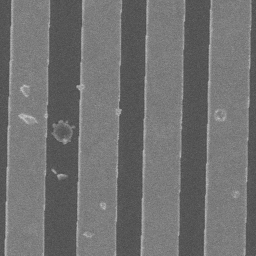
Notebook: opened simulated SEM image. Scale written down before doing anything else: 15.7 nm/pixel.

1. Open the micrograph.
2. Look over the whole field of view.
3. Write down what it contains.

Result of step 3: lines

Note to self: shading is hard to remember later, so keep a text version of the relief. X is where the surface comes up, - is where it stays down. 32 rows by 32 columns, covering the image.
-XXXXX----XXXXX---XXXXX---XXXXX-
-XXXXX----XXXXX---XXXXX---XXXXX-
-XXXXX----XXXXX---XXXXX---XXXXX-
-XXXXX----XXXXX---XXXXX---XXXXX-
-XXXXX----XXXXX---XXXXX---XXXXX-
-XXXXX----XXXXX---XXXXX---XXXXX-
-XXXXX----XXXXX---XXXXX---XXXXX-
-XXXXX----XXXXX---XXXXX---XXXXX-
-XXXXX----XXXXX---XXXXX---XXXXX-
-XXXXX----XXXXX---XXXXX---XXXXX-
-XXXXX----XXXXX---XXXXX---XXXXX-
-XXXXX----XXXXX---XXXXX---XXXXX-
-XXXXX----XXXXX---XXXXX---XXXXX-
-XXXXX----XXXXX---XXXXX---XXXXX-
-XXXXX----XXXXX---XXXXX---XXXXX-
-XXXXX----XXXXX---XXXXX---XXXXX-
-XXXXX-XX-XXXXX---XXXXX---XXXXX-
-XXXXX----XXXXX---XXXXX---XXXXX-
-XXXXX----XXXXX---XXXXX---XXXXX-
-XXXXX----XXXXX---XXXXX---XXXXX-
-XXXXX----XXXXX---XXXX----XXXXX-
-XXXXX----XXXXX---XXXX----XXXXX-
-XXXXX----XXXXX---XXXX----XXXXX-
-XXXXX----XXXXX---XXXX----XXXXX-
-XXXXX----XXXXX---XXXX----XXXXX-
-XXXXX----XXXXX---XXXX----XXXXX-
-XXXX-----XXXXX---XXXX----XXXXX-
-XXXX-----XXXXX---XXXX----XXXXX-
-XXXX-----XXXX----XXXX----XXXXX-
-XXXX-----XXXX----XXXX----XXXXX-
-XXXX-----XXXX----XXXX----XXXXX-
-XXXX-----XXXX----XXXX----XXXXX-